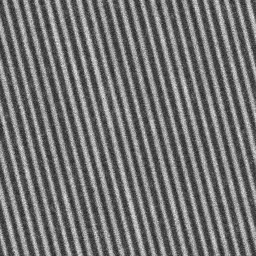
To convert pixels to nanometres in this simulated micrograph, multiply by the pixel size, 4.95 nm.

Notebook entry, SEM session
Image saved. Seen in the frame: parallel lines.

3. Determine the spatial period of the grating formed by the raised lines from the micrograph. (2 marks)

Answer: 50.7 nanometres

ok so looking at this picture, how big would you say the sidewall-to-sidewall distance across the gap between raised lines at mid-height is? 31.1 nm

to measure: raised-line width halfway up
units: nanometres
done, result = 22.2